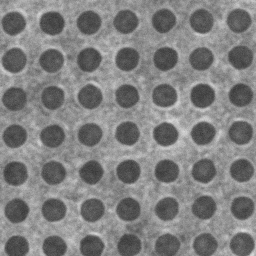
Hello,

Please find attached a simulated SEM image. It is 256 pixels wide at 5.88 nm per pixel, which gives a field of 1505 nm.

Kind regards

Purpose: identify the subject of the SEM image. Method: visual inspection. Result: a regular array of holes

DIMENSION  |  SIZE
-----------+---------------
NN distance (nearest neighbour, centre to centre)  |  37 px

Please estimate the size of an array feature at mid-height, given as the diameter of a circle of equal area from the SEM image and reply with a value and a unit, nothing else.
0.148 µm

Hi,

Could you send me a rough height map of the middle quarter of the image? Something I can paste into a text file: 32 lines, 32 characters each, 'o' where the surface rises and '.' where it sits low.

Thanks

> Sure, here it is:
ooo......oooo......oooo.....oooo
oooo....oooooo...ooooooo...ooooo
oooooooooooooooooooooooooooooooo
oooooooooooooooooooooooooooooooo
oooooooooooooooooooooooooooooooo
ooooo...oooooo....ooooo....ooooo
oooo.....oooo.....oooo......oooo
oooo......ooo......ooo......ooo.
ooo.......ooo......ooo.......oo.
oooo......ooo......ooo......oooo
ooooo....ooooo...oooooo....ooooo
oooooooooooooooooooooooooooooooo
oooooooooooooooooooooooooooooooo
oooooooooooooooooooooooooooooooo
ooooooooooooooo..ooooooooooooooo
oooo.....oooo.....ooooo.....oooo
oooo......ooo......ooo......oooo
ooo.......ooo......ooo.......ooo
ooo.......ooo......ooo.......ooo
oooo.....ooooo....ooooo.....oooo
ooooo...oooooooo.ooooooo..oooooo
oooooooooooooooooooooooooooooooo
oooooooooooooooooooooooooooooooo
oooooooooooooooooooooooooooooooo
ooooo....ooooo....oooooo....oooo
oooo.....oooo......oooo......ooo
oooo......ooo......ooo.......ooo
.ooo......ooo......ooo.......ooo
oooo......ooo......oooo......ooo
ooooo....ooooo....ooooooo..ooooo
oooooooooooooooooooooooooooooooo
oooooooooooooooooooooooooooooooo